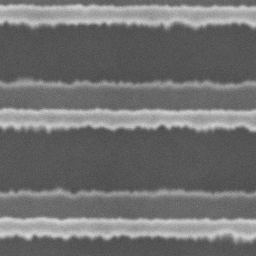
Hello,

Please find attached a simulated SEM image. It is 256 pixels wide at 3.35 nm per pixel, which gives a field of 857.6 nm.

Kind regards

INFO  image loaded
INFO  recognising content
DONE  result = lines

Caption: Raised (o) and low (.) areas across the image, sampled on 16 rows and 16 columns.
oooooooooooooooo
.........o..o...
................
................
................
oooooooooooooooo
oooooooooooooooo
oooooooooooooooo
................
................
................
................
oooooooooooooooo
oooooooooooooooo
oooooooooooooooo
................